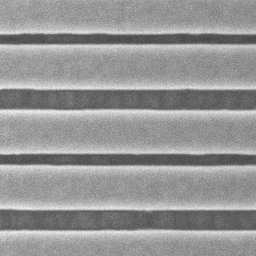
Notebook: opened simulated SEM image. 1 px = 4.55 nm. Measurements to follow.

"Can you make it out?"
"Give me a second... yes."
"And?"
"lines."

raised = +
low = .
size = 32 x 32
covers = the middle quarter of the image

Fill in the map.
++++++++++++++++++++++++++++++++
++++++++++++++++++++++++++++++++
++++++++++++++++++++++++++++++++
++++++++++++++++++++++++++++++++
++++++++++++++++++++++++++++++++
++++++++++++++++++++++++++++++++
................................
................................
................................
................................
................................
..........++++..................
++++++++++++++++++++++++++++++++
++++++++++++++++++++++++++++++++
++++++++++++++++++++++++++++++++
++++++++++++++++++++++++++++++++
++++++++++++++++++++++++++++++++
++++++++++++++++++++++++++++++++
++++++++++++++++++++++++++++++++
++++++++++++++++++++++++++++++++
++++++++++++++++++++++++++++++++
++++++++++++++++++++++++++++++++
.................++............+
................................
................................
++++++++++++++++++++++++++++++..
++++++++++++++++++++++++++++++++
++++++++++++++++++++++++++++++++
++++++++++++++++++++++++++++++++
++++++++++++++++++++++++++++++++
++++++++++++++++++++++++++++++++
++++++++++++++++++++++++++++++++